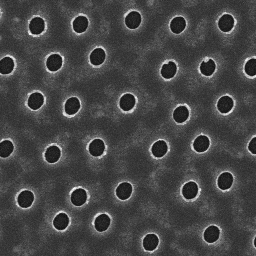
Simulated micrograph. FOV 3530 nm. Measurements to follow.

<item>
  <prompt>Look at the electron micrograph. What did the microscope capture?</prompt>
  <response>a regular array of holes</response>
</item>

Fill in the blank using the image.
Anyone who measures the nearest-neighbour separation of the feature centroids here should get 538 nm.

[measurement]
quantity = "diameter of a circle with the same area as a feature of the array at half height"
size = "235 nm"